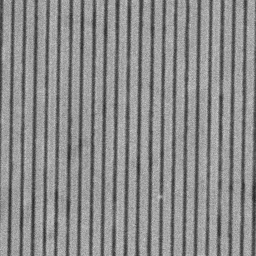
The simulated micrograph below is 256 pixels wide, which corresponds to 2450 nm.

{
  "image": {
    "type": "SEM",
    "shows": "parallel lines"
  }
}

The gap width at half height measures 45.5 nm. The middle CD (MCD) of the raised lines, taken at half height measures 6.62 pixels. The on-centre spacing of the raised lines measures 111 nanometers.